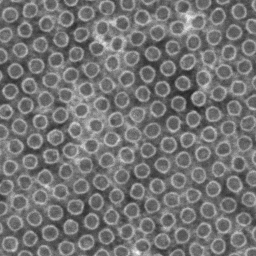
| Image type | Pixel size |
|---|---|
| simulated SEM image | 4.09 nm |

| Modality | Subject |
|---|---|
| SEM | a regular array of raised bodies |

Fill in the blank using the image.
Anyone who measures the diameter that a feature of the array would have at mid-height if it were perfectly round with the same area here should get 58.4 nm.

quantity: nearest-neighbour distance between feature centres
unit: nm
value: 83.6